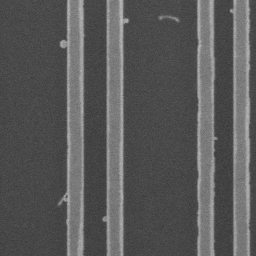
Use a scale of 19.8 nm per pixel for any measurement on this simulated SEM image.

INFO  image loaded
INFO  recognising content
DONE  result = lines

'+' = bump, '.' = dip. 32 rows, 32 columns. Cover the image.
........++...++..........+...++.
........++...++..........+...++.
........++...++..........++..++.
........++...++..........++..++.
........++...++..........++..++.
........++...++..........++..++.
........++...++..........++..++.
........++...++..........++..++.
........++...++..........++..++.
........++...++..........++..++.
........++...++..........++..++.
........++...++..........++..++.
........++...++..........++..++.
........++...++..........++..++.
........++...++..........++..++.
........++...++..........++..++.
........++...++..........++..++.
........++...++..........++..++.
.........+...++..........++..++.
........++...++..........++..++.
........++...++..........++..++.
........++...++..........++..++.
........++...++..........++..++.
........++...++..........++..++.
........++...++..........++..++.
........++...++..........++..++.
........++...++..........++..++.
........++...++..........++..++.
........++...++..........++..++.
........++...++..........++..++.
........++...++..........++..++.
........++....+..........++..++.